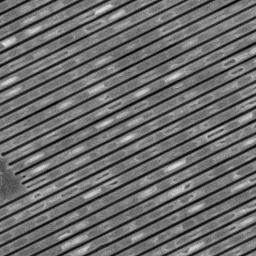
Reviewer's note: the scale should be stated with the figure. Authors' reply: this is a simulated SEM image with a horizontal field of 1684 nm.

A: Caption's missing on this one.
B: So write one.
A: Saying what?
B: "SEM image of parallel lines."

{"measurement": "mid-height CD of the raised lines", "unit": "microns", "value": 0.0568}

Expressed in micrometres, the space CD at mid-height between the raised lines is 0.0192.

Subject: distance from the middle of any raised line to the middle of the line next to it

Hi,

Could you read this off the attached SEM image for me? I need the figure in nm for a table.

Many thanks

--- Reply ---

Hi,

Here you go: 75.9